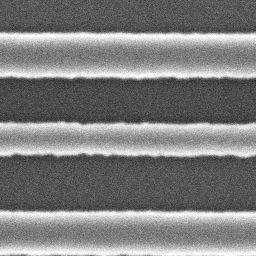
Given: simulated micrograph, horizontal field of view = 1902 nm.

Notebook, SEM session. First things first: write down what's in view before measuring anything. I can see lines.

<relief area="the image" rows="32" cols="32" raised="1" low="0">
00000000000000000000000000000000
00000000000000000000000000000000
00000000000000000000000000000000
00000000000000000000000000000000
11111111111111111111111010111111
11111111111111111111111111111111
11111111111111111111111111111111
11111111111111111111111111111111
11111111111111111111111111111111
00011000100100011111001101011111
00000000000000000000000000000000
00000000000000000000000000000000
00000000000000000000000000000000
00000000000000000000000000000000
00000000000000000000000000000000
11000111110000000010000000000000
11111111111111111111111111111111
11111111111111111111111111111111
11111111111111111111111111111111
00000000000000000000000000000010
00000000000000000000000000000000
00000000000000000000000000000000
00000000000000000000000000000000
00000000000000000000000000000000
00000000000000000000000000000000
00000000000000000000000000000000
00000000000000000000000000000000
11111111111111111111111111111111
11111111111111111111111111111111
11111111111111111111111111111111
11111111111111111111111111111111
11111111111111111111111111111111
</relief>